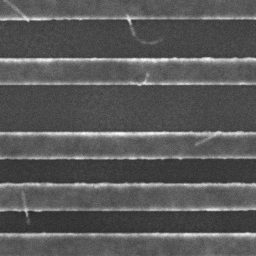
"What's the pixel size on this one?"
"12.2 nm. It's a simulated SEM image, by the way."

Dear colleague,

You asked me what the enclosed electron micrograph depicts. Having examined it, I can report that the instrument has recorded lines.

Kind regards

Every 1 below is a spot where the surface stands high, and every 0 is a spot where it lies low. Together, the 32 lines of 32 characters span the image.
11111111111111111111111111111111
11111111111111111111111111111111
00010000000000000000000000000000
00000000000000000000000000000000
00000000000000000000000000000000
00000000000000000000000000000000
00000000000000000000000000000000
11111111111111111111111111111111
11111111111111111111111111111111
11111111111111111111111111111111
11111111111111111111111111111111
00000000000000000000000000000000
00000000000000000000000000000000
00000000000000000000000000000000
00000000000000000000000000000000
00000000000000000000000000000000
00000000000000000000000000000000
11111111111111111111111111111111
11111111111111111111111111111111
11111111111111111111111111111111
00000000000000000000000000000000
00000000000000000000000000000000
00000000000000000000000000000000
11111111111111111111111111111111
11111111111111111111111111111111
11111111111111111111111111111111
00000000000000000000000000000000
00000000000000000000000000000000
00000000000000000000000000000000
11111111111111111111111111111111
11111111111111111111111111111111
11111111111111111111111111111111